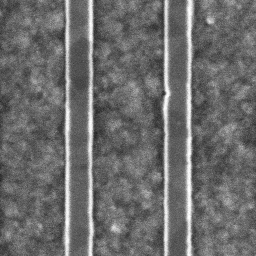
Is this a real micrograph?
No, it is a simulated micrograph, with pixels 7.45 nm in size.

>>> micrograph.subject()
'one or a few lines or trenches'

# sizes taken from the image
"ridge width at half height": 182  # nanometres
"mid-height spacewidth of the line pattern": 0.556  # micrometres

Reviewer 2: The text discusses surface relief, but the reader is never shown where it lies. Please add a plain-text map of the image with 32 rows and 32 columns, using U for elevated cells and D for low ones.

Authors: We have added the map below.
DDDDDDDDUUUDDDDDDDDDDUUUDDDDDDDD
DDDDDDDDUUUDDDDDDDDDDUUUDDDDDDDD
DDDDDDDDUUUDDDDDDDDDDUUUDDDDDDDD
DDDDDDDDUUUDDDDDDDDDDUUUDDDDDDDD
DDDDDDDDUUUDDDDDDDDDDUUUDDDDDDDD
DDDDDDDDUUUDDDDDDDDDDUUUDDDDDDDD
DDDDDDDDUUUDDDDDDDDDDUUUDDDDDDDD
DDDDDDDDUUUDDDDDDDDDDUUUDDDDDDDD
DDDDDDDDUUUDDDDDDDDDDUUUDDDDDDDD
DDDDDDDDUUUDDDDDDDDDDUUUDDDDDDDD
DDDDDDDDUUUDDDDDDDDDDUUUDDDDDDDD
DDDDDDDDUUUDDDDDDDDDDUUUDDDDDDDD
DDDDDDDDUUUDDDDDDDDDDUUUDDDDDDDD
DDDDDDDDUUUDDDDDDDDDDUUUDDDDDDDD
DDDDDDDDUUUDDDDDDDDDDUUUDDDDDDDD
DDDDDDDDUUUDDDDDDDDDDUUUDDDDDDDD
DDDDDDDDUUUDDDDDDDDDDUUUDDDDDDDD
DDDDDDDDUUUDDDDDDDDDDUUUDDDDDDDD
DDDDDDDDUUUDDDDDDDDDDUUUDDDDDDDD
DDDDDDDDUUUDDDDDDDDDDUUUDDDDDDDD
DDDDDDDDUUUDDDDDDDDDDUUUDDDDDDDD
DDDDDDDDUUUDDDDDDDDDDUUUDDDDDDDD
DDDDDDDDUUUDDDDDDDDDDUUUDDDDDDDD
DDDDDDDDUUUDDDDDDDDDDUUUDDDDDDDD
DDDDDDDDUUUDDDDDDDDDDUUUDDDDDDDD
DDDDDDDDUUUDDDDDDDDDDUUUDDDDDDDD
DDDDDDDDUUUDDDDDDDDDDUUUDDDDDDDD
DDDDDDDDUUUDDDDDDDDDDUUUDDDDDDDD
DDDDDDDDUUUDDDDDDDDDDUUUDDDDDDDD
DDDDDDDDUUUDDDDDDDDDDUUUDDDDDDDD
DDDDDDDDUUUDDDDDDDDDDUUUDDDDDDDD
DDDDDDDDUUUDDDDDDDDDDUUUDDDDDDDD